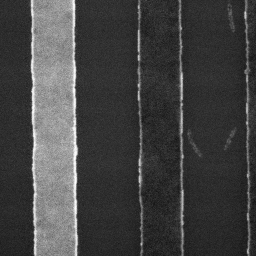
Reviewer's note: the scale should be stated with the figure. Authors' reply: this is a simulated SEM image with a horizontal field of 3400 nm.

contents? lines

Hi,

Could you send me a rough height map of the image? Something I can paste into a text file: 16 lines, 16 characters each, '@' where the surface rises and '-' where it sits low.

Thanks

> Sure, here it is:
--@@@----@@----@
--@@@----@@----@
--@@@----@@----@
--@@@----@@----@
--@@@----@@----@
--@@@----@@----@
--@@@----@@----@
--@@@----@@----@
--@@@----@@----@
--@@@----@@----@
--@@@----@@----@
--@@@----@@-----
--@@@----@@-----
--@@@----@@-----
--@@@----@@-----
--@@@----@@-----